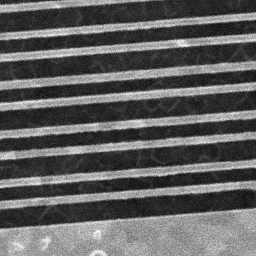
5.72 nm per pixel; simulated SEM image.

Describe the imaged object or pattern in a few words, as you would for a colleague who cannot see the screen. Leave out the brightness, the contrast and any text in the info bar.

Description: parallel lines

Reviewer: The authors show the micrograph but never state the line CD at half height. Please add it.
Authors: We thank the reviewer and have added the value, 36.3 nm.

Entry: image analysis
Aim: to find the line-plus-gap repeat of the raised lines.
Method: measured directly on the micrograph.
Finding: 138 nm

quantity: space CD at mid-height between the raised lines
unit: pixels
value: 20.8